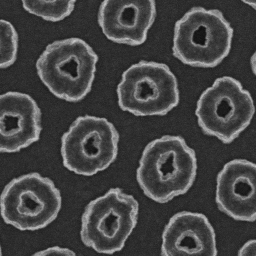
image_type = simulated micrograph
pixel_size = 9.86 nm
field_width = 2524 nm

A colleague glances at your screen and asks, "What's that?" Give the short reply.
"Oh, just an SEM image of ring-shaped raised bodies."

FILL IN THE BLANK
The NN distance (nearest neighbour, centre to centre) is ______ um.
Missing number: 0.767